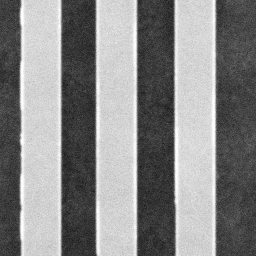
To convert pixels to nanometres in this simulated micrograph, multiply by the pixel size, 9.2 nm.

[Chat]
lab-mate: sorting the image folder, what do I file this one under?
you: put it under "lines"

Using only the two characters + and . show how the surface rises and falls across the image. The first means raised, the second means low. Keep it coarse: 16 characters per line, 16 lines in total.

.+++..++...++...
.+++..++...++...
.+++..++...++...
.+++..++...++...
.+++..++...++...
.+++..++...++...
.+++..++...++...
.+++..++...++...
.+++..++...++...
.+++..++...++...
.+++..++...++...
.+++..++...++...
.+++..++...++...
.+++..++...++...
.+++..++...++...
.+++..++...++...